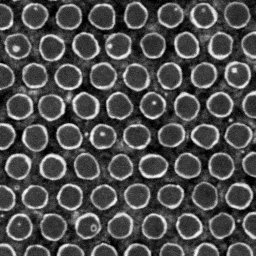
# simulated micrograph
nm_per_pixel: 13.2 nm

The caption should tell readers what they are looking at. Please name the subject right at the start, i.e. a regular array of raised bodies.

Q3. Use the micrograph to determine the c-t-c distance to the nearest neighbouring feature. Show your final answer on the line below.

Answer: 0.441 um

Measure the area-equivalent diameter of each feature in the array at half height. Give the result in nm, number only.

333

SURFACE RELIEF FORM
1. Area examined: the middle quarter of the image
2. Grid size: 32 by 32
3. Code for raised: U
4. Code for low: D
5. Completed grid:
UUDDDDDDUUUUDDDDUUUDDDDDUUUUDDDD
UUUUDDDUUUUUUDDDUUUUUDDDUUUUUDDD
UUUUDDDUUUUUUDDUUUUUUDDDUUUUUDDD
UUUUDDDUUUUUUDDUUUUUUDDDUUUUUDDD
UUUUDDDUUUUUDDDUUUUUUDDDUUUUUDDD
UUUDDDDDUUUDDDDDUUUUUDDDDUUUUDDD
DDDDDDDDDDDDDDDDDDDDDDDDDDDDDDDD
DDDDUUDDDDDDUUUDDDDDDUUDDDDDDDUD
DDDUUUUUDDDUUUUUDDDDUUUUDDDDUUUU
DDUUUUUUDDDUUUUUUDDUUUUUUDDDUUUU
DDUUUUUUDDDUUUUUUDDUUUUUUDDDUUUU
DDDUUUUUDDDUUUUUUDDUUUUUUDDDUUUU
DDDUUUUUDDDUUUUUUDDDUUUUDDDDUUUU
DDDDDUDDDDDDDUUDDDDDDUUDDDDDDUUU
DDDDDDDDDDDDDDDDDDDDDDDDDDDDDDDD
UUUDDDDDDUUDDDDDUUUUDDDDDUUUUDDD
UUUUDDDUUUUUDDDUUUUUUDDDUUUUUUDD
UUUUDDDUUUUUUDDUUUUUUUDDUUUUUUDD
UUUUDDDUUUUUUDDUUUUUUDDDUUUUUUDD
UUUUDDDUUUUUUDDUUUUUUDDDUUUUUDDD
UUUUDDDDUUUUDDDDUUUUDDDDDUUUDDDD
DDDDDDDDDDDDDDDDDDDDDDDDDDDDDDDD
DDDDUUDDDDDDDDDDDDDDDDDDDDDDDDUU
DDDUUUUDDDDDUUUUDDDDUUUUUDDDDUUU
DDDUUUUUDDDDUUUUUDDUUUUUUUDDUUUU
DDDUUUUUDDDUUUUUUDDUUUUUUUDDUUUU
DDDUUUUUUDDUUUUUUDDUUUUUUDDDUUUU
DDDUUUUUUDDDUUUUUDDDUUUUUDDDUUUU
DDDDUUUUDDDDDUUDDDDDDDDDDDDDDDUU
DDDDDDDDDDDDDDDDDDDDDDDDDDDDDDDD
UUDDDDDDDUUDDDDDUUUUDDDDDUUUDDDD
UUUUDDDDUUUUDDDDUUUUUDDDUUUUUUDD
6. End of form